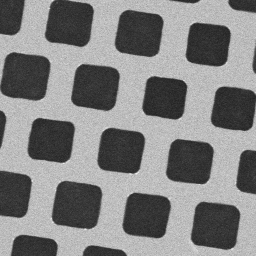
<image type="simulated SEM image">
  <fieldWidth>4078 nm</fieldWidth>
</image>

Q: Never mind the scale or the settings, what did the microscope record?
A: a regular array of holes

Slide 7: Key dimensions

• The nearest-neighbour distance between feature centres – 1100 nm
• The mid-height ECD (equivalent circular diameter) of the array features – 0.763 um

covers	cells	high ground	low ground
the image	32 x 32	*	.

...***.....******************...
...***......***...**************
...***......***.....************
...***.....****.....****....****
******.....****.....****.....***
********...***......***......***
***************.....***......***
*.....*****************.....****
......****....******************
......***......*****************
......***......***.....*********
......***......***.....****.....
****.****......***.....****.....
***********...****.....****.....
.******************....***......
.***.....******************.....
.***.....****....***************
****.....***......****.*********
****.....***......***......*****
****.....***......***......***..
************......***......***..
.**************..****.....****..
....*****************.....****..
....***.....******************..
....***......***....************
....***......***.....****..*****
...****.....****.....***......**
*******.....***......***......**
**********.****......***......**
**..*************...****......**
**.....*****************.....***
*......***.....*****************